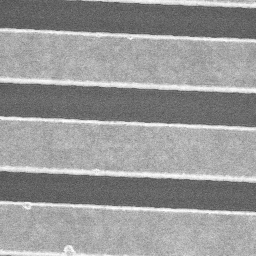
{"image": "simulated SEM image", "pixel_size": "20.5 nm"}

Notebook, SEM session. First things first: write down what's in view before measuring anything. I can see lines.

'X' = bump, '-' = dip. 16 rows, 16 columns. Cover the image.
----------------
----------------
XXXXXXXXXXXXXXXX
XXXXXXXXXXXXXXXX
XXXXXXXXXXXXXXXX
---------XXXXXXX
----------------
XXXXX-----------
XXXXXXXXXXXXXXXX
XXXXXXXXXXXXXXXX
XXXXXXXXXXXXXXXX
----------------
----------------
XXXXXXXXXXXXXXXX
XXXXXXXXXXXXXXXX
XXXXXXXXXXXXXXXX